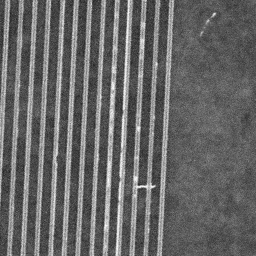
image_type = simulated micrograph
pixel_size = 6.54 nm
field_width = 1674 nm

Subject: parallel lines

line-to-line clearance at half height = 62.8 nanometers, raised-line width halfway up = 0.0228 um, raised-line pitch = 13.7 px